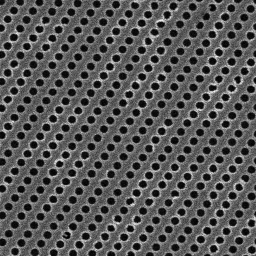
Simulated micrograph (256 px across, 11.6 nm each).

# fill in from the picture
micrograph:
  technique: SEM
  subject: a regular array of holes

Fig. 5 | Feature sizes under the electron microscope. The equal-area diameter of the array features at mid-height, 0.091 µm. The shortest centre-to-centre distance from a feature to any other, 124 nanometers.